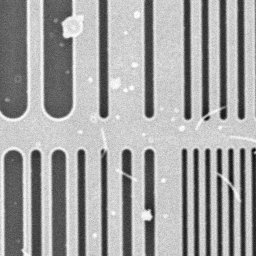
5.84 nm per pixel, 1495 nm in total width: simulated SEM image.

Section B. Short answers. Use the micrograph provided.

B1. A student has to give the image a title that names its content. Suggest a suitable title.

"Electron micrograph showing groups of lines, slits or small figures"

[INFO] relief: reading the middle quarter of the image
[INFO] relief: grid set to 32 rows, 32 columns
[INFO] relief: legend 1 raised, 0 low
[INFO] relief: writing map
00011111100111111111000111111100
00011111100111111111000111111100
00011111100111111111000111111100
00011111100111111111000111111100
00011111100111111111000111111100
00011111100111111111000111111100
00011111100111111111000111111100
00011111100111111111000111111100
00011111100111111111000111111100
00011111100111111111000111111100
00111111100011111111000111111100
00111111100011111111000111111100
00111111100111111111000111111100
11111111100111111111101111111100
11111111111111111111111111111111
11111111111111111111111111111111
11111111111111111111111111111111
11111111111111111111111111111111
11111111111111111111111111111111
11111111111111111111111111111111
11111111111111111111111111111111
11110111101111100111001111111001
01100011100111000111000111111001
01100011100111000111000111111001
01100011100111000111000111111001
01100011100111000111000111111001
01100011100111000111000111111001
01100011100111100111000111111001
01100011100111000111000111111001
01100011100111000111000111111001
01100011100111000111000111111001
01100011100111000111000111111001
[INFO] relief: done